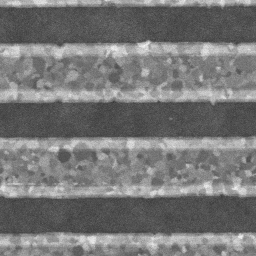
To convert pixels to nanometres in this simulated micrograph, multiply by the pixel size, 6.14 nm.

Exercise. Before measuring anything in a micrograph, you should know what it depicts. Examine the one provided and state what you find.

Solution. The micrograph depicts one or a few lines or trenches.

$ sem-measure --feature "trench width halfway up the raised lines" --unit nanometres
306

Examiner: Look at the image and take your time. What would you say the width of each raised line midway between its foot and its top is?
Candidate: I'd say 277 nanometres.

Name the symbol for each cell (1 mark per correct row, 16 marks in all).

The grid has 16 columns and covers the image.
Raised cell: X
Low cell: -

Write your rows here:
----------------
----------------
----------------
XXXXXXXXXXXXXXXX
XXXXXXXXXXXXXXXX
XXXXXXXXXXXXXXXX
----------------
----------------
----------------
XXXXXXXXXXXXXXXX
XXXXXXXXXXXXXXXX
XXXXXXXXXXXXXXXX
----------------
----------------
----------------
XXXXXXXXXXXXXXXX